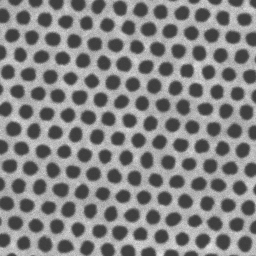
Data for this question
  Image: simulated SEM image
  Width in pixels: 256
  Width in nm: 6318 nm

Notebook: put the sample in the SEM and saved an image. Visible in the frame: a regular array of holes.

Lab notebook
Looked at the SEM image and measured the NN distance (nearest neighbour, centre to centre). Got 506 nanometres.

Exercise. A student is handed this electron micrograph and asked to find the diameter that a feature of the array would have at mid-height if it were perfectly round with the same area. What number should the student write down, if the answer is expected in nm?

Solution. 362